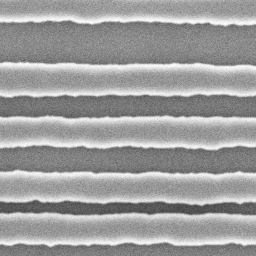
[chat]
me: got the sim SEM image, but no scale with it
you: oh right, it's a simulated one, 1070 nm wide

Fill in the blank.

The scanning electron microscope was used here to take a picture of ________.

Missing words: lines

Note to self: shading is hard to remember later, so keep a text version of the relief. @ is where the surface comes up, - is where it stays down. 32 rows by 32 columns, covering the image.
@@@@@@@@@@@@@@@@@@@@@@@@@@@@@@@@
@@@@@@@@@@@@@@@@@@@@@@@@@@@@@@@@
@@@@@@@@-@@@@@@@@@@@@@@@@@@@@@@@
--------------------------------
--------------------------------
--------------------------------
--------------------------------
--------------------------------
@@@@@@@@@@@@@@@@@@@@@@@@@@@@@@@@
@@@@@@@@@@@@@@@@@@@@@@@@@@@@@@@@
@@@@@@@@@@@@@@@@@@@@@@@@@@@@@@@@
@@@@@@@@@@@@@@@@@@@@@@@@@@@@@@@@
--------------------------------
--------------------------------
--------------------------------
@@@@@@@@@@@@@@@@@@@@@@@@@@@@@@@@
@@@@@@@@@@@@@@@@@@@@@@@@@@@@@@@@
@@@@@@@@@@@@@@@@@@@@@@@@@@@@@@@@
------------@-----------@@@@----
--------------------------------
--------------------------------
-@@@----------------------------
@@@@@@@@@@@@@@@@@@@@@@@@@@@@@@@@
@@@@@@@@@@@@@@@@@@@@@@@@@@@@@@@@
@@@@@@@@@@@@@@@@@@@@@@@@@@@@@@@@
------------------------@@------
--------------------------------
@@@@@@@@@@@@@@@@@@@@@@@@@@@@@@@@
@@@@@@@@@@@@@@@@@@@@@@@@@@@@@@@@
@@@@@@@@@@@@@@@@@@@@@@@@@@@@@@@@
@@----@--@@-----------@@@@------
--------------------------------